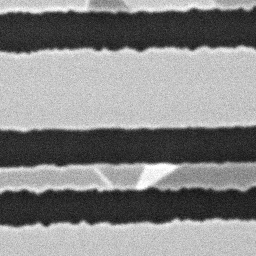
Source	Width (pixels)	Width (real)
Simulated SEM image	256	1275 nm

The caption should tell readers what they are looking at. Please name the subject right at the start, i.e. lines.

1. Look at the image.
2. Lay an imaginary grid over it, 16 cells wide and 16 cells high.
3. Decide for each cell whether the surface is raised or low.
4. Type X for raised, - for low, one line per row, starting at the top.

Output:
XXXXXXXXXXXX-XX-
----------------
----------------
XXXXXXXXXXXXXXXX
XXXXXXXXXXXXXXXX
XXXXXXXXXXXXXXXX
XXXXXXXXXXXXXXXX
XXXXXXXXXXXXXXXX
----------------
----------------
-XXXXXXXXXXXXXXX
XXXXXXXXXXXXXXXX
----------------
----------------
XXXXXXXXXXXXXXXX
XXXXXXXXXXXXXXXX